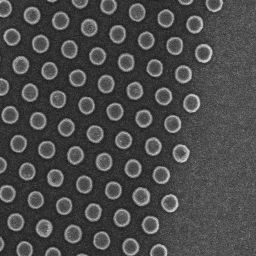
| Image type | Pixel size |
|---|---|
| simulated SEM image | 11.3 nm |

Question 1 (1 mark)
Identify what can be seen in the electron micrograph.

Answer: a regular array of raised bodies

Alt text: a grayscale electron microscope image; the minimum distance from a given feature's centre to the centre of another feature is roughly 328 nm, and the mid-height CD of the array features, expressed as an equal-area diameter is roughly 0.186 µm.